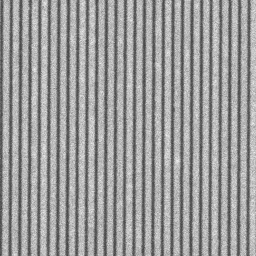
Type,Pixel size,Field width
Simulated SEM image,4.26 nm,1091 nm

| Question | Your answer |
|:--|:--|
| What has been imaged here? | parallel lines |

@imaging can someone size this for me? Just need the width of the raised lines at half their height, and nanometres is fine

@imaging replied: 26.1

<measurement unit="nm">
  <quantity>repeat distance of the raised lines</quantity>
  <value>40.5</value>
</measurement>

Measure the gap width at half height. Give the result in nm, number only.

14.9